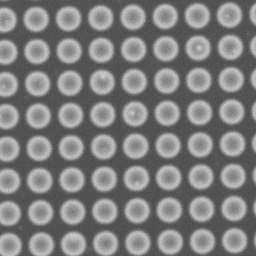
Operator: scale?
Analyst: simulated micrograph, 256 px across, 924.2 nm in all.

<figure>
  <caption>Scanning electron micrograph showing an array of small figures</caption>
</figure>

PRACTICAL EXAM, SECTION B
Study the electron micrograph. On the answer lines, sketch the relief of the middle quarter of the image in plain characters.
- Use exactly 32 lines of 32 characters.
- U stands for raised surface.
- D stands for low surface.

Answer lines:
DDDDDDDDDDDDDDDDDDDDDDDDDDDDDDDD
DDDDDDDDDDDDDDDDDUUDDDDDDUUDDDDD
UUUDDDDUUUUUDDDUUUUUDDDUUUUUDDDU
UUUUDDDUUUUUDDDUUUUUDDDUUUUUUDDU
UUUUDDDUUUUUDDDUUUUUUDDUUUUUUDDU
UUUUDDDUUUUUDDDUUUUUDDDUUUUUDDDU
UUUUDDDUUUUUDDDUUUUUDDDDUUUUDDDD
UUUDDDDDDDDDDDDDDDDDDDDDDDDDDDDD
DDDDDDDDDDDDDDDDDDDDDDDDDDDDDDDD
DDDDDDDDDDDDDDDDDDUDDDDDDUUDDDDD
UUUUDDDDUUUUDDDUUUUUDDDUUUUUDDDU
UUUUDDDUUUUUUDDUUUUUUDDUUUUUUDDU
UUUUUDDUUUUUUDDUUUUUUDDUUUUUUDDU
UUUUUDDUUUUUUDDUUUUUUDDUUUUUUDDU
UUUUDDDUUUUUDDDUUUUUDDDDUUUUDDDD
UUUDDDDDDUDDDDDDDDDDDDDDDDDDDDDD
DDDDDDDDDDDDDDDDDDDDDDDDDDDDDDDD
DDDDDDDDDDDDDDDDDDUDDDDDDDDDDDDD
UUUUDDDDUUUUDDDDUUUUDDDDUUUUDDDD
UUUUDDDUUUUUUDDUUUUUUDDUUUUUUDDU
UUUUUDDUUUUUUDDUUUUUUDDUUUUUUDDU
UUUUUDDUUUUUUDDUUUUUUDDUUUUUUDDU
UUUUDDDUUUUUDDDDUUUUDDDDUUUUDDDD
UUUDDDDDDUUDDDDDDDDDDDDDDDDDDDDD
DDDDDDDDDDDDDDDDDDDDDDDDDDDDDDDD
DDDDDDDDDDDDDDDDDDDDDDDDDDDDDDDD
UUUUDDDDUUUUDDDDUUUUDDDDUUUUDDDD
UUUUUDDUUUUUUDDUUUUUUDDUUUUUUDDU
UUUUUDDUUUUUUDDUUUUUUDDUUUUUUDDU
UUUUUDDUUUUUUDDUUUUUUDDUUUUUUDDD
UUUUUDDDUUUUUDDDUUUUUDDDUUUUDDDD
DUUUDDDDDUUDDDDDDDDDDDDDDDDDDDDD